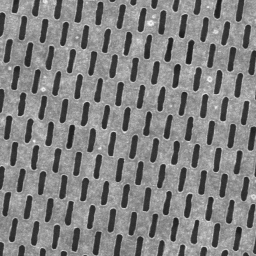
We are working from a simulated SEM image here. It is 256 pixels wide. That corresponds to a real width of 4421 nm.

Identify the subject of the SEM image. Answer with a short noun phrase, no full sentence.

a regular array of holes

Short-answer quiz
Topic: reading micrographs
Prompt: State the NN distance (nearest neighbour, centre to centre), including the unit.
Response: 362 nanometers